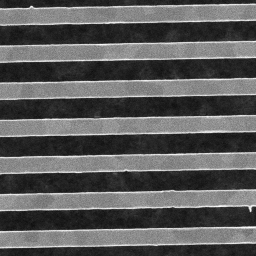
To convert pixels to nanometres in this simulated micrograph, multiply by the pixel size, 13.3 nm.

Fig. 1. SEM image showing parallel lines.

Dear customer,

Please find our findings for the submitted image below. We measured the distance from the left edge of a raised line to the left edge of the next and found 495 nm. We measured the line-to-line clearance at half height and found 275 nanometres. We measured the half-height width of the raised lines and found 218 nanometres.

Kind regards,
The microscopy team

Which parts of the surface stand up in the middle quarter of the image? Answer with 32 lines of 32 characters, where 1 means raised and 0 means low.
00000000000000000000000000000000
00000000000000000000000000000000
00000000000000000000000000000000
00000000000000000000000000000000
00011111111111111111111111111111
11111111111111111111111111111111
11111111111111111111111111111111
11111111111111111111111111111111
10000000000000000000000000000000
00000000000000000000000000000000
00000000000000000000000000000000
00000000000000000000000000000000
00000000100000000000000000000000
00000000100000011000111111111111
11111111111111111111111111111111
10111111111111111111111111111111
11111111111111111111111111111111
11111111111110000000000000000000
00000000000000000010000000000000
00000000000000000000000000000000
00000000000000000000000000000000
00000000000000000000000000000000
00000000000000000000000000000000
11111111111111111111111111111111
11111111111111111111111111111111
11111111111111111111111111111111
11111111111111111111111111111000
00000000000000000000000000000000
00000000000000000000000000000000
00000000000000000000000000000000
00000000000000000000000000000000
00000000000000000000000000000000